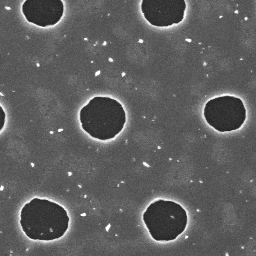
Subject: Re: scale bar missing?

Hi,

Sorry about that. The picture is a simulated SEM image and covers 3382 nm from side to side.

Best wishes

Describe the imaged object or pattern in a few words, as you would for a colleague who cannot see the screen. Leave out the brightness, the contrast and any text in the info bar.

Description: holes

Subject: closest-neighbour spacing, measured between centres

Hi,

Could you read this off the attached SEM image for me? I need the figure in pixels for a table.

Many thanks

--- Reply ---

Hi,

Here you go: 119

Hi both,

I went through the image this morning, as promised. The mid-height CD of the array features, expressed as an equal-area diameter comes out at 0.573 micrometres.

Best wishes